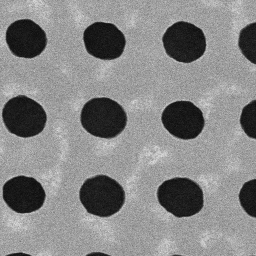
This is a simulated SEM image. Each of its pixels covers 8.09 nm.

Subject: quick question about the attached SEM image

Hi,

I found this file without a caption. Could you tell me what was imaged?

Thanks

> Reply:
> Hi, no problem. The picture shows a regular array of holes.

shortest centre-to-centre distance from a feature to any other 627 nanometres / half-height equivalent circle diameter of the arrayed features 341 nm